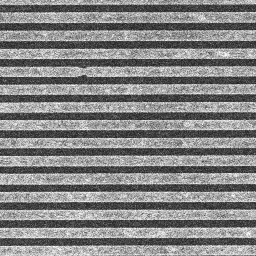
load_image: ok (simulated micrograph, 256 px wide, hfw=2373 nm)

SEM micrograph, parallel lines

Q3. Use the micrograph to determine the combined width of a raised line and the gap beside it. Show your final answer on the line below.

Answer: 166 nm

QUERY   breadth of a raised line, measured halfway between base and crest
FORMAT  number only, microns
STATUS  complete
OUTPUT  0.0916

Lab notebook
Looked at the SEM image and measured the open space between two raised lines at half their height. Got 73 nanometers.